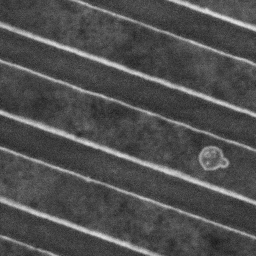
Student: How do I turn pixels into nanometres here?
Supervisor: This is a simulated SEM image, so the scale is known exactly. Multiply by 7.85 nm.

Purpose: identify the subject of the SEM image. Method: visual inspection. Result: lines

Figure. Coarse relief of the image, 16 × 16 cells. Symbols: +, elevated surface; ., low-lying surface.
++++++......++++
+++++++++......+
...+++++++++....
.....++++++++++.
++......++++++++
+++++......+++++
++++++++......++
.++++++++++.....
....++++++++++..
+......+++++++++
++++......++++++
+++++++......+++
+++++++++......+
...+++++++++....
.....++++++++++.
++......++++++++